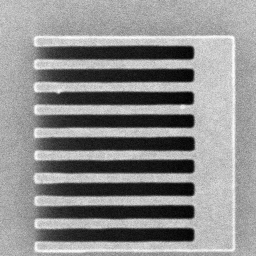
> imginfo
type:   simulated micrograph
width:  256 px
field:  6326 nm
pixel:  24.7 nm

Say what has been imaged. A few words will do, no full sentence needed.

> groups of lines, slits or small figures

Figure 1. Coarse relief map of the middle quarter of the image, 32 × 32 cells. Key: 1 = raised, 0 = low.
11111111111111111111111111111111
00000000000000000000000000000000
00000000000000000000000000000000
00000000000000000000000000000000
00000000000000000000000000000000
11111111111111111111111111111111
11111111111111111111111111111111
00000000000000000000000000000000
00000000000000000000000000000000
00000000000000000000000000000000
11111111111111111111111111111111
11111111111111111111111111111111
11111111111111111111011111111111
00000000000000000000000000000000
00000000000000000000000000000000
00000000000000000000000000000000
11111111111111111111111111111111
11111111111111111111111111111111
00000000000000000000000000000000
00000000000000000000000000000000
00000000000000000000000000000000
00000000000000000000000000000000
11111111111111111111111111111111
11111111111111111111111111111111
00000000000000000000000000000000
00000000000000000000000000000000
00000000000000000000000000000000
00000111000000100000000000000001
11111111111111111111111111111111
11111111111111111111111111111111
00000000000000000000000000000000
00000000000000000000000000000000